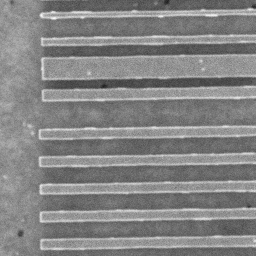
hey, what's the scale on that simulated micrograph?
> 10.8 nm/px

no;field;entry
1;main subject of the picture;groups of lines, slits or small figures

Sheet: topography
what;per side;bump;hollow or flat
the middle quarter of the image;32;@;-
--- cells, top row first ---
@@@@@@@@@@@@@@@@@@@@@@@@@@@@@@@@
@@@@@@@@@@@@@@@@@@@@@@@@@@@@@@@@
@@@@@@@@@@@@@@@@@@@@@@@@@@@@@@@@
@@@@@@@@@-----------------------
--------------------------------
--------------------------------
@@@@@@@@@@@@@@@@@@@@@@@@@@@@@@@@
@@@@@@@@@@@@@@@@@@@@@@@@@@@@@@@@
@@@@@@@@@@@@@@@@@@@@@@@@@-------
--------------------------------
--------------------------------
--------------------------------
--------------------------------
--------------------------------
--------------------------------
--------------------------------
@@@@@@@@@@@@@@@@@@@@@@@@@@@@@@@@
@@@@@@@@@@@@@@@@@@@@@@@@@@@@@@@@
@@@@----------------------------
--------------------------------
--------------------------------
--------------------------------
--------------------------------
@@@@@@@@@@@@@@@@@@@@@@@@@@@@@@@@
@@@@@@@@@@@@@@@@@@@@@@@@@@@@@@@@
--------------------------------
--------------------------------
--------------------------------
--------------------------------
--------------------------------
@@@@@@@@@@@@@@@@@@@@@@@@@@@@@@@@
@@@@@@@@@@@@@@@@@@@@@@@@@@@@@@@@